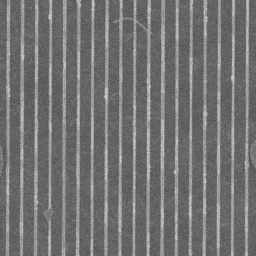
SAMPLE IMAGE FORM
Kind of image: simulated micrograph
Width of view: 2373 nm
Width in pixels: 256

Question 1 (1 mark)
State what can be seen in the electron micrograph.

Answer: parallel lines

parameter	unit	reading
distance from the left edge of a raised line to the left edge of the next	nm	130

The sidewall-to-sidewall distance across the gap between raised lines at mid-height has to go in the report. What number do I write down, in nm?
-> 110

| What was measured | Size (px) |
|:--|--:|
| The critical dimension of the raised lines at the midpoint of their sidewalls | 2.13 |